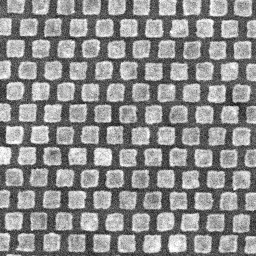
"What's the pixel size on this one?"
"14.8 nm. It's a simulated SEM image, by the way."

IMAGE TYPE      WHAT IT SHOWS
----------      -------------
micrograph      a regular array of raised bodies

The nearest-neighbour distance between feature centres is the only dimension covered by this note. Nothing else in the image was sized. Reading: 361 nanometers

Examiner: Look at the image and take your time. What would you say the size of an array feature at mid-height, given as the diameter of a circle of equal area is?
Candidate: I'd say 272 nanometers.